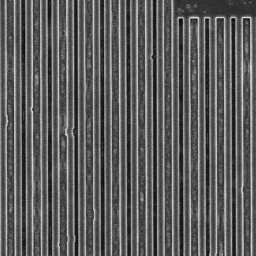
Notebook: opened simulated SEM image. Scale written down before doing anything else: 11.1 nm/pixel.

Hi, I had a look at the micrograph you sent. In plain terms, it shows parallel lines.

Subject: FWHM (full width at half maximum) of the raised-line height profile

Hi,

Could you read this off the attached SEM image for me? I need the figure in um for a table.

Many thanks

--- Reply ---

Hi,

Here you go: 0.0766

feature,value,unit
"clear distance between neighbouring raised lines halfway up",83.6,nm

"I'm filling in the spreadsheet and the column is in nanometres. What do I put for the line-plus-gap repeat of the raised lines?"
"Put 145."